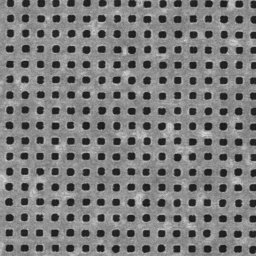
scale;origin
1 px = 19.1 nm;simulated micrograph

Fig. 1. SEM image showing a regular array of holes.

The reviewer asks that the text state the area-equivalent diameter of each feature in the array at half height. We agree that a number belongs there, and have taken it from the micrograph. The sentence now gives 165 nanometers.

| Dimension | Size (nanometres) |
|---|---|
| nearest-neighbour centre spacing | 284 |